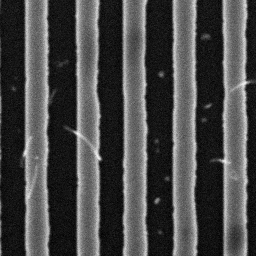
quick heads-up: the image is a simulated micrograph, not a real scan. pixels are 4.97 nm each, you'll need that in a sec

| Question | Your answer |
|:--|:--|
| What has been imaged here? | lines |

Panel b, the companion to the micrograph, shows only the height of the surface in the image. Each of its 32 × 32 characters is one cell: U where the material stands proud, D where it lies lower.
DDDUUUDDDDUUDDDUUUDDDDUUDDDDUUUD
DDDUUUDDDDUUDDDUUUDDDDUUDDDDUUUD
DDDUUUDDDUUUDDDUUUDDDDUUDDDDUUUD
DDDUUUDDDDUUDDDUUUDDDDUUDDDDUUUD
DDDUUUDDDDUUDDDUUUDDDDUUDDDDUUUD
DDDUUUDDDDUUDDDUUUDDDDUUDDDDUUUD
DDDUUUDDDDUUDDDUUUDDDDUUDDDDUUUD
DDDUUUDDDDUUDDDUUUDDDDUUDDDDUUUD
DDDUUUDDDDUUDDDUUUDDDDUUDDDDUUUD
DDDUUUDDDDUUDDDUUUDDDDUUDDDDUUUD
DDDUUUDDDDUUDDDUUUDDDDUUDDDDUUUD
DDDUUUDDDDUUDDDUUUDDDDUUDDDDUUUD
DDDUUUDDDDUUDDDDUUDDDDUUDDDDUUUD
DDDUUUDDDDUUDDDDUUDDDDUUDDDDUUUD
DDDUUUDDDDUUDDDDUUDDDDUUDDDDUUUD
DDDUUUDDDDUUDDDDUUDDDDUUDDDDUUUD
DDDUUUDDDDUUDDDDUUDDDDUUDDDDUUUD
DDDUUUDDDDUUDDDDUUDDDDUUDDDDUUUD
DDDUUUDDDDUUDDDDUUDDDDUUDDDDUUUD
DDDUUUDDDDUUDDDDUUDDDDUUDDDDUUUD
DDDUUUDDDDUUDDDUUUDDDDUUDDDDUUUD
DDDUUUDDDDUUDDDUUUDDDDUUDDDDUUUD
DDDUUUDDDDUUDDDUUUDDDDUUDDDDUUUD
DDDUUUDDDDUUDDDUUUDDDDUUDDDDUUUD
DDDUUUDDDDUUDDDDUUDDDDUUDDDDUUUD
DDDUUUDDDDUUDDDDUUDDDDUUDDDDUUUD
DDDUUUDDDDUUDDDUUUDDDDUUDDDDUUUD
DDDUUUDDDDUUDDDUUUDDDDUUUDDDUUUD
DDDUUUDDDDUUDDDUUUDDDDUUUDDDUUUD
DDDUUUDDDDUUDDDUUUDDDDUUUDDDUUUD
DDDUUUDDDDUUDDDUUUDDDDUUUDDDUUUD
DDDUUUDDDDUUDDDUUUDDDDUUUDDDUUUD